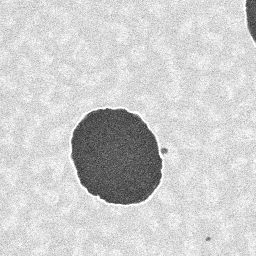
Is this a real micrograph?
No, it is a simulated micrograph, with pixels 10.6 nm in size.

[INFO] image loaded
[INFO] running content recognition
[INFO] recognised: holes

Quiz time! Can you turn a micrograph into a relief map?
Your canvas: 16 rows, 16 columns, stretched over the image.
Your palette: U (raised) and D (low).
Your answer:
UUUUUUUUUUUUUUUD
UUUUUUUUUUUUUUUD
UUUUUUUUUUUUUUUU
UUUUUUUUUUUUUUUU
UUUUUUUUUUUUUUUU
UUUUUUUUUUUUUUUU
UUUUUUUUUUUUUUUU
UUUUUDDDDUUUUUUU
UUUUUDDDDDUUUUUU
UUUUDDDDDDUUUUUU
UUUUUDDDDDUUUUUU
UUUUUDDDDDUUUUUU
UUUUUUDDDUUUUUUU
UUUUUUUUUUUUUUUU
UUUUUUUUUUUUUUUU
UUUUUUUUUUUUUUUU